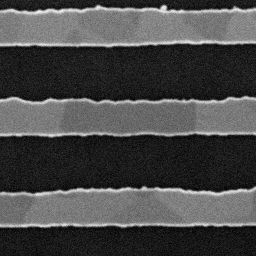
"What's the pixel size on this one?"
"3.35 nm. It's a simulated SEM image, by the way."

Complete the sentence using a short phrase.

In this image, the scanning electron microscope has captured lines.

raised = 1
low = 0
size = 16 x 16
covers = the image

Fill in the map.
0000001000000000
1111111111111111
1111111111111111
0000000000000000
0000000000000000
0000000000000000
1111111111111111
1111111111111111
0000000000000000
0000000000000000
0000000000000000
0000000000000000
1111111111111111
1111111111111111
0000000000000000
0000000000000000